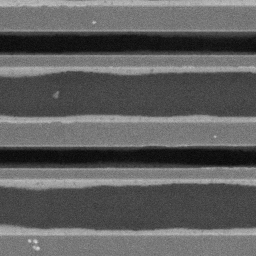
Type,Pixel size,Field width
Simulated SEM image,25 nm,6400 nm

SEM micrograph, lines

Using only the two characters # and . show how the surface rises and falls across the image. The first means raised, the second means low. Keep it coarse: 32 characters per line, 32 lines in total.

..#####..................#######
################################
################################
################################
................................
................................
................................
################################
################################
................................
................................
................................
................................
................................
................................
################################
################################
################################
................................
................................
................................
################################
################################
................................
................................
................................
................................
................................
................................
################################
################################
################################